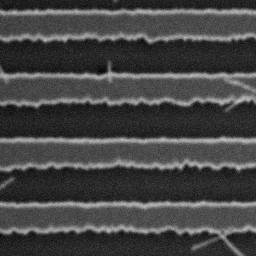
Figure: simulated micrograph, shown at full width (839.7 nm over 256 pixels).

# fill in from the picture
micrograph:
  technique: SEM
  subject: lines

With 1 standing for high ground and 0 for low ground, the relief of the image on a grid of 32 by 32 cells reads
00000000000000000000000000000000
11111111111111111111111111111111
11111111111111111111111111111111
11111111111111111111111111111111
11111111111111111111111111111111
00000000000000000000000000000000
00000000000000000000000000000000
00000000000000000000000000000000
00000000000000000000000000000000
11111111111111111111111111111111
11111111111111111111111111111111
11111111111111111111111111111111
11111111111111111111111111111111
00000000000000000000000000000000
00000000000000000000000000000000
00000000000000000000000000000000
00000000000000000000000000000000
11111111001000111000111100011111
11111111111111111111111111111111
11111111111111111111111111111111
11111111111111111111111111111111
00000000000000000000000000000000
00000000000000000000000000000000
00000000000000000000000000000000
00000000000000000000000000000000
11111011111111111111111111111111
11111111111111111111111111111111
11111111111111111111111111111111
11111111111111111111111111111111
00000000000000000000000000000000
00000000000000000000000000000000
00000000000000000000000000000000